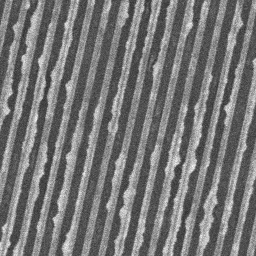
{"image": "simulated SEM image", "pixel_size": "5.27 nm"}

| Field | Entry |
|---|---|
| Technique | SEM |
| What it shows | parallel lines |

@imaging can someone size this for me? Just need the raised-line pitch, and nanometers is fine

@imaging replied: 84.9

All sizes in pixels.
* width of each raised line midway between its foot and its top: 6.72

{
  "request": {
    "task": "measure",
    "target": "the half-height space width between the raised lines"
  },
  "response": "50.9 nm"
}